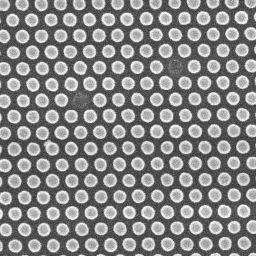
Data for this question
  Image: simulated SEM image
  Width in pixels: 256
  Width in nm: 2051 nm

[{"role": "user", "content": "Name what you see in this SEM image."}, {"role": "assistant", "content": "a regular array of raised bodies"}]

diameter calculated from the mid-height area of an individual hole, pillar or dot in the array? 98.2 nanometres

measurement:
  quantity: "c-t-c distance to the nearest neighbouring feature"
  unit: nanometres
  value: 147